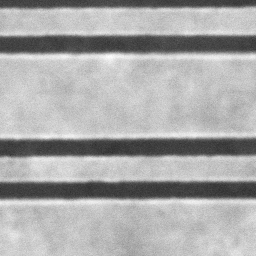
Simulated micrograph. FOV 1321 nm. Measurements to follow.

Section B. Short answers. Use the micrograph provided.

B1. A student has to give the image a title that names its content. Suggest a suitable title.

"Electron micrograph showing lines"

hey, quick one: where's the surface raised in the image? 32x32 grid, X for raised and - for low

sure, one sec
--------------------------------
XXXXXXXXXXXXXXXXXXXXXXXXXXXXXXXX
XXXXXXXXXXXXXXXXXXXXXXXXXXXXXXXX
XXXXXXXXXXXXXXXXXXXXXXXXXXXXXXXX
--------------------------------
--------------------------------
--------------------------------
XXXXXXXXXXXXXXXXXXXXXXXXXXXXXXXX
XXXXXXXXXXXXXXXXXXXXXXXXXXXXXXXX
XXXXXXXXXXXXXXXXXXXXXXXXXXXXXXXX
XXXXXXXXXXXXXXXXXXXXXXXXXXXXXXXX
XXXXXXXXXXXXXXXXXXXXXXXXXXXXXXXX
XXXXXXXXXXXXXXXXXXXXXXXXXXXXXXXX
XXXXXXXXXXXXXXXXXXXXXXXXXXXXXXXX
XXXXXXXXXXXXXXXXXXXXXXXXXXXXXXXX
XXXXXXXXXXXXXXXXXXXXXXXXXXXXXXXX
XXXXXXXXXXXXXXXXXXXXXXXXXXXXXXXX
--------------------------------
--------------------------------
--------------------------------
XXXXXXXXXXXXXXXXXXXXXXXXXXXXXXXX
XXXXXXXXXXXXXXXXXXXXXXXXXXXXXXXX
XXXXXXXXXXXXXXXXXXXXXXXXXXXXXXXX
--------------------------------
--------------------------------
XXXXXXXXXXXXXXXXXXXXXXXXXXXXXXXX
XXXXXXXXXXXXXXXXXXXXXXXXXXXXXXXX
XXXXXXXXXXXXXXXXXXXXXXXXXXXXXXXX
XXXXXXXXXXXXXXXXXXXXXXXXXXXXXXXX
XXXXXXXXXXXXXXXXXXXXXXXXXXXXXXXX
XXXXXXXXXXXXXXXXXXXXXXXXXXXXXXXX
XXXXXXXXXXXXXXXXXXXXXXXXXXXXXXXX